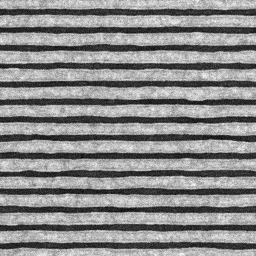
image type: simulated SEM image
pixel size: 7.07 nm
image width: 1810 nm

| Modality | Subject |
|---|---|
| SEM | parallel lines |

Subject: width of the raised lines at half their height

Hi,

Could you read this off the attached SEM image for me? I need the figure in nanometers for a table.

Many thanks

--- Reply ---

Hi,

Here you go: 81.4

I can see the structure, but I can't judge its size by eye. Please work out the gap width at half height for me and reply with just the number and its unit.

0.0495 um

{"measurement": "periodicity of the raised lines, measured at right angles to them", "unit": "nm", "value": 127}